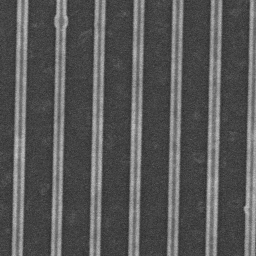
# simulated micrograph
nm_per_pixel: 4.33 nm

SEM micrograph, parallel lines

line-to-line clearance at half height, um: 0.139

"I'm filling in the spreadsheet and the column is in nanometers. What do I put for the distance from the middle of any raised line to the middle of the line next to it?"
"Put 168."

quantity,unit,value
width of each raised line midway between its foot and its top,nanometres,29.2